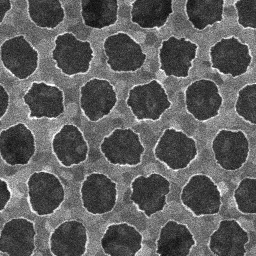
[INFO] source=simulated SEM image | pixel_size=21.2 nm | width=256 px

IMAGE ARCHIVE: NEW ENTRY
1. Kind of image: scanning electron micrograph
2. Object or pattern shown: a regular array of holes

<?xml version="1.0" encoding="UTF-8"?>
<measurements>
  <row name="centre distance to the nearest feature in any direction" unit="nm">1080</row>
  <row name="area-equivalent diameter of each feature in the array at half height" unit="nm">828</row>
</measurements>